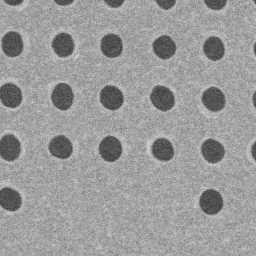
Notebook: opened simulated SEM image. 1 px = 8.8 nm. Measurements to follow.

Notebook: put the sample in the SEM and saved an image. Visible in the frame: a regular array of holes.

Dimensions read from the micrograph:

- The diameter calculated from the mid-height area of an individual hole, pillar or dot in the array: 224 nanometers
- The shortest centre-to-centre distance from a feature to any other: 441 nanometres